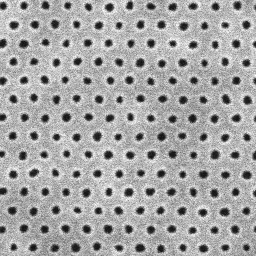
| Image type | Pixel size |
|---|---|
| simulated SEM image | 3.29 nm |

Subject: a regular array of holes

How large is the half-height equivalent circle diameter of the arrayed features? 28 nanometers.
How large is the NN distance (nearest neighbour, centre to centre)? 0.0673 µm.